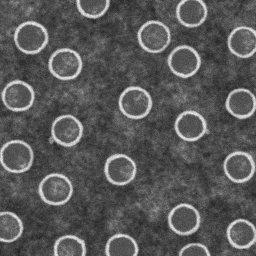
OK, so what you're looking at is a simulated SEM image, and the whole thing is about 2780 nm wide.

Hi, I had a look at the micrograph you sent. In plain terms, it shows a regular array of raised bodies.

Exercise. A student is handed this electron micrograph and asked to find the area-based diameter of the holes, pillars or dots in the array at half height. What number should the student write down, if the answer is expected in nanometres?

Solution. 326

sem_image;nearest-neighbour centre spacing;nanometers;649